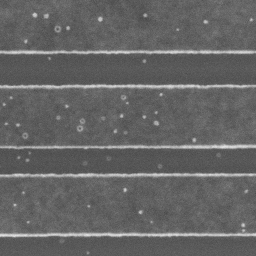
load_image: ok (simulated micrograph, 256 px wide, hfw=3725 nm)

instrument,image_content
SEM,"lines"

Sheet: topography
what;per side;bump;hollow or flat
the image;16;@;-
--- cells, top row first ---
@@@@@@@@@@@@@@@@
@@@@@@@@@@@@@@@@
@@@@@@@@@@@@@@@@
----------------
----------------
@@@@@@@@@@@@@@@@
@@@@@@@@@@@@@@@@
@@@@@@@@@@@@@@@@
@@@@@@@@@@@@@@@@
----------------
----------------
@@@@@@@@@@@@@@@@
@@@@@@@@@@@@@@@@
@@@@@@@@@@@@@@@@
@@@@@@@@@@@@@@@@
----------------